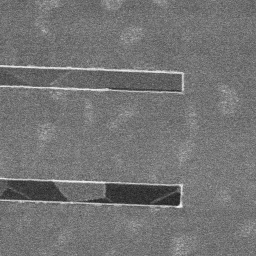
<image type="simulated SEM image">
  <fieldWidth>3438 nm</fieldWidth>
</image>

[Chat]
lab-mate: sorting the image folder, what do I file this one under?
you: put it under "one or a few lines or trenches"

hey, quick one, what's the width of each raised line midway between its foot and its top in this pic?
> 292 nm